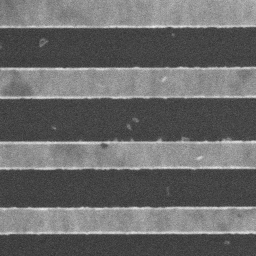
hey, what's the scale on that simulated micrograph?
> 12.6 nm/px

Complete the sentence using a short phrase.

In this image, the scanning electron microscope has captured lines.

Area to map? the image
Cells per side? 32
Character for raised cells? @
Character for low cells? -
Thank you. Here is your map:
@@@@@@@@@@@@@@@@@@@@@@@@@@@@@@@@
@@@@@@@@@@@@@@@@@@@@@@@@@@@@@@@@
@@@@@@@@@@@@@@@@@@@@@@@@@@@@@@@@
--------------------------------
--------------------------------
--------------------------------
--------------------------------
--------------------------------
----------------@@----@-@-@@@@@@
@@@@@@@@@@@@@@@@@@@@@@@@@@@@@@@@
@@@@@@@@@@@@@@@@@@@@@@@@@@@@@@@@
@@@@@@@@@@@@@@@@@@@@@@@@@@@@@@@@
--------------------------------
--------------------------------
--------------------------------
--------------------------------
--------------------------------
--------------------------------
@@@@@@@@@@@@@@@@@@@@@@@@@@@@@@@@
@@@@@@@@@@@@@@@@@@@@@@@@@@@@@@@@
@@@@@@@@@@@@@@@@@@@@@@@@@@@@@@@@
--------------------------------
--------------------------------
--------------------------------
--------------------------------
--------------------------------
@@@@@@@@@@@@@@@@@@@@@@@@@@@@@@@@
@@@@@@@@@@@@@@@@@@@@@@@@@@@@@@@@
@@@@@@@@@@@@@@@@@@@@@@@@@@@@@@@@
--------------------------------
--------------------------------
--------------------------------